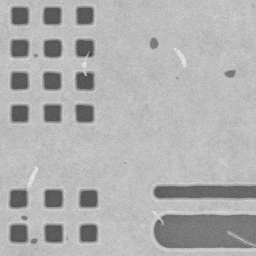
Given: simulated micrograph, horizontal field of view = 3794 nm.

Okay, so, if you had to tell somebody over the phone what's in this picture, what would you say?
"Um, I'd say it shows groups of lines, slits or small figures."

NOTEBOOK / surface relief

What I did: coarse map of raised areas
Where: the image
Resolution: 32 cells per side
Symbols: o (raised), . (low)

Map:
oooooooooooooooooooooooooooooooo
o...o...o...oooooooooooooooooooo
o...o...o...oooooooooooooooooooo
oooooooooooooooooooooooooooooooo
oooooooooooooooooooooooooooooooo
o...o...o...oooooooooooooooooooo
o...o...o...oooooooooooooooooooo
oooooooooooooooooooooooooooooooo
oooooooooooooooooooooooooooooooo
o...o...o...oooooooooooooooooooo
o...o...o...oooooooooooooooooooo
oooooooooooooooooooooooooooooooo
oooooooooooooooooooooooooooooooo
o...o...o...oooooooooooooooooooo
o...o...o...oooooooooooooooooooo
oooooooooooooooooooooooooooooooo
oooooooooooooooooooooooooooooooo
oooooooooooooooooooooooooooooooo
oooooooooooooooooooooooooooooooo
oooooooooooooooooooooooooooooooo
oooooooooooooooooooooooooooooooo
oooooooooooooooooooooooooooooooo
oooooooooooooooooooooooooooooooo
ooooooooooooooooooo.............
o...o...oo..ooooooo.............
o...oo..oo..oooooooooooooooooooo
oooooooooooooooooooooooooooooooo
oooooooooooooooooooo............
o..ooo..oo..ooooooo.............
o...oo..oo..ooooooo.............
oo.ooooooooooooooooo............
oooooooooooooooooooooooooooooooo